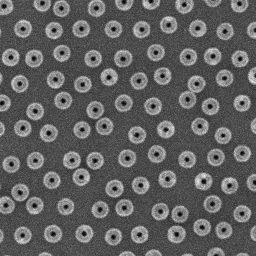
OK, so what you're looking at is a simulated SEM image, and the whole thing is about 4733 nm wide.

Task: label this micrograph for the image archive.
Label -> a regular array of ring-shaped raised bodies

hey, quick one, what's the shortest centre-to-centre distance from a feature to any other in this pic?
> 448 nanometres